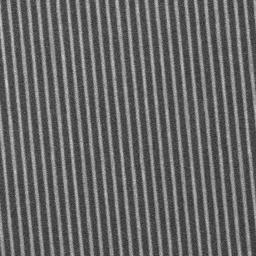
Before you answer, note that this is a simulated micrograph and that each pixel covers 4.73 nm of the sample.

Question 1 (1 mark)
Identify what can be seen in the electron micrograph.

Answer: parallel lines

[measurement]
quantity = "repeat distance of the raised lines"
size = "46.4 nm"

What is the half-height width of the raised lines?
0.0141 micrometres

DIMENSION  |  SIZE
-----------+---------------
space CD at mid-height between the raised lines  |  33.6 nanometers